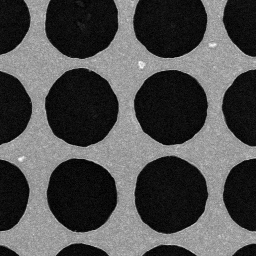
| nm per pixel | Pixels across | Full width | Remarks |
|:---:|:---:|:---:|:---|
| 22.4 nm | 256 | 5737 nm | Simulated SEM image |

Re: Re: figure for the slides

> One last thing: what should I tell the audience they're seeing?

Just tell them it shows holes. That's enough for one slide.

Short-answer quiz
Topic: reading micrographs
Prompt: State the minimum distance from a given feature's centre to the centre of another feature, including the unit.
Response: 1960 nm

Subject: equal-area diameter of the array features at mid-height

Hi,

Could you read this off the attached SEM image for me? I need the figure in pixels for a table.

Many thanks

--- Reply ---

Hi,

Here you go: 74.6